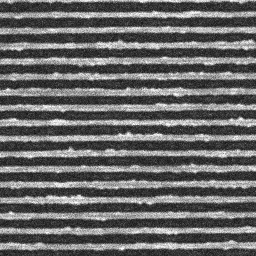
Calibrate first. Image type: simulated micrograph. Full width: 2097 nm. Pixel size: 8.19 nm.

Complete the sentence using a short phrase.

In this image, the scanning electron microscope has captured parallel lines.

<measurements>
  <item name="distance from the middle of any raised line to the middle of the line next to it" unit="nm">126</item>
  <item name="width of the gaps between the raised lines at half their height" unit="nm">81.9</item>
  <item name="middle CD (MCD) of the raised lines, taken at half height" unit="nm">45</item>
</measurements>